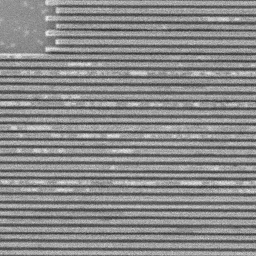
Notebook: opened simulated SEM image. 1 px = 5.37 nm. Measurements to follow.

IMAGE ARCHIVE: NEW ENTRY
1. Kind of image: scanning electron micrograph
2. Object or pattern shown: parallel lines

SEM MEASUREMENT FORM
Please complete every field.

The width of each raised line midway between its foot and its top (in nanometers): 24.8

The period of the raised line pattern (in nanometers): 42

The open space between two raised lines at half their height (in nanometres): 20.1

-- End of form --